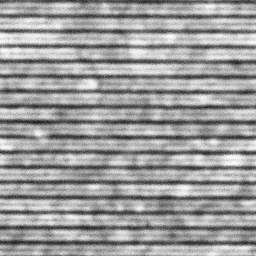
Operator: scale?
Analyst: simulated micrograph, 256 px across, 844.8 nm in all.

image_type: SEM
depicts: parallel lines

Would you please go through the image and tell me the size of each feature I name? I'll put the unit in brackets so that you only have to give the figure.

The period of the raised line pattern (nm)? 24.8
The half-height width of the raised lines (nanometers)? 11.5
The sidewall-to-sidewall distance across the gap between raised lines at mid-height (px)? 5.24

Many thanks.